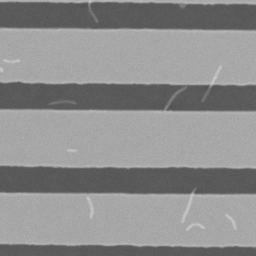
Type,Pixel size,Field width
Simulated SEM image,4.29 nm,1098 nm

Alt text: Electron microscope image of lines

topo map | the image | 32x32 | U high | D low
DDDDDDDDDDDDDDDDDDDDDDDDDUUDUDDU
DDDDDDDDDDDDDDDDDDDDDDDDDDDDDDDD
DDDDDDDDDDDDDDDDDDDDDDDDDDDDDDDD
DDDDDDDDDDDDDDDDDDDDDDDDDDDDDDDD
UUUUUUUUUUUUUUUUUUUUUUUUUUUUUUUU
UUUUUUUUUUUUUUUUUUUUUUUUUUUUUUUU
UUUUUUUUUUUUUUUUUUUUUUUUUUUUUUUU
UUUUUUUUUUUUUUUUUUUUUUUUUUUUUUUU
UUUUUUUUUUUUUUUUUUUUUUUUUUUUUUUU
UUUUUUUUUUUUUUUUUUUUUUUUUUUUUUUU
DDDDDDDDDDDDDDDDDDUDDUUUUUUUUUUU
DDDDDDDDDDDDDDDDDDDDDDDDDDDDDDDD
DDDDDDDDDDDDDDDDDDDDDDDDDDDDDDDD
DDDDDDDDDDDDDDDDDDDDDDDDDDDDDDDD
UUUUUUUUUUUUUUUUUUUUUUUUUUUUUUUU
UUUUUUUUUUUUUUUUUUUUUUUUUUUUUUUU
UUUUUUUUUUUUUUUUUUUUUUUUUUUUUUUU
UUUUUUUUUUUUUUUUUUUUUUUUUUUUUUUU
UUUUUUUUUUUUUUUUUUUUUUUUUUUUUUUU
UUUUUUUUUUUUUUUUUUUUUUUUUUUUUUUU
UUUUUUUUUUUUUUUUUUUUUUUUUUUUUUUU
DDDDDDDDDDDDDDDDDDDDDDDDDDDDDDDD
DDDDDDDDDDDDDDDDDDDDDDDDDDDDDDDD
DDDDDDDDDDDDDDDDDDDDDDDDDDDDDDDD
UUUUUUUUUUUUUUUUUUUUUUUUUUUUUUUU
UUUUUUUUUUUUUUUUUUUUUUUUUUUUUUUU
UUUUUUUUUUUUUUUUUUUUUUUUUUUUUUUU
UUUUUUUUUUUUUUUUUUUUUUUUUUUUUUUU
UUUUUUUUUUUUUUUUUUUUUUUUUUUUUUUU
UUUUUUUUUUUUUUUUUUUUUUUUUUUUUUUU
DUDUUUUUUUUUUUUUUUUUUUUUUUUUUUUU
DDDDDDDDDDDDDDDDDDDDDDDDDDDDDDDD